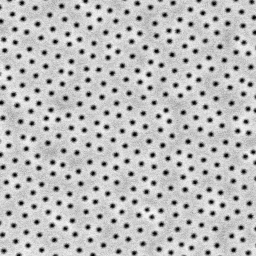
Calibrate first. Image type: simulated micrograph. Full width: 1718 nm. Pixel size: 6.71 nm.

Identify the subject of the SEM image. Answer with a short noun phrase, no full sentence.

a regular array of holes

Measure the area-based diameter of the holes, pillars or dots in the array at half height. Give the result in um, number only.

0.0386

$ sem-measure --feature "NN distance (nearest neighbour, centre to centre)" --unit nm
82.1